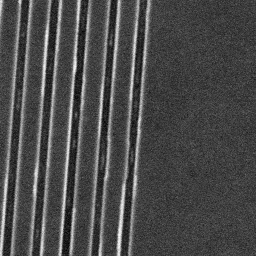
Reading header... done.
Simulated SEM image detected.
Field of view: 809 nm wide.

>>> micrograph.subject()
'parallel lines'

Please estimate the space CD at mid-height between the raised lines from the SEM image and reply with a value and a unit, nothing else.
24.8 nm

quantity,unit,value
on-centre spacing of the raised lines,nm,93.1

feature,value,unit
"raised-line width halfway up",66.2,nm